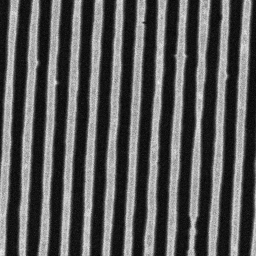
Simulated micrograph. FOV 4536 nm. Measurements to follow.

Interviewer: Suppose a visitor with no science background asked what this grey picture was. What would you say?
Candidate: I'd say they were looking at parallel lines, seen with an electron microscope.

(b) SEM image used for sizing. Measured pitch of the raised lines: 0.375 um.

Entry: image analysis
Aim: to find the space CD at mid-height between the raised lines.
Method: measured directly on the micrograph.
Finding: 0.221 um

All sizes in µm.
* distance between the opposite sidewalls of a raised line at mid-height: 0.153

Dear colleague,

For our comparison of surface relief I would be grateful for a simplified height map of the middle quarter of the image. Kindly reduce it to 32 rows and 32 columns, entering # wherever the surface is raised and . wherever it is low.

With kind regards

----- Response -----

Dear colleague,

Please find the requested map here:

.###...##...##....#....##...##..
.###...##...##...##....##...##..
.###...##...##...##....##...##..
.###...##...##...##....##...##..
.###...##...##...##....#....##..
.##...##....##...##....#....##..
.##...##....##...##....#....##..
.##...##....##...##....#....##..
.##...##....##...##...##....##..
.##...##....##...##...##....##..
.##...##....##...##...##....##..
.##...##....##...##...##....##..
.##...##....##...##...##...###..
.##...##....##...##...##...##...
.##...##....##...##...##...##...
.##...##....#....##...##...##...
.##...##...##....#....##...##...
.##...##...##...###...##...##...
.##...##...##...##....##...##...
##....##...##...##....##...##...
##....##...##...##....##...##...
.#....##...##...##....##...##...
##....##...##...##...##....##...
##....#....##...##...##....##...
##...##....##...##...##....##...
##...##....##...##...##....##...
##...##....##...##...##....##...
##...##....##...##...##....##...
##...##....##...##...##...###...
##...##....##...##...##...##....
##...##....##...##...##...##....
##...##....##...##...##...##....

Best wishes